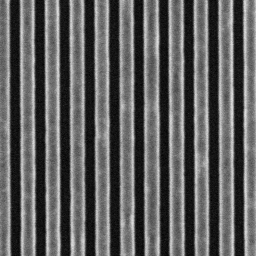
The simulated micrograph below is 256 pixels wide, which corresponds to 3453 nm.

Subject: parallel lines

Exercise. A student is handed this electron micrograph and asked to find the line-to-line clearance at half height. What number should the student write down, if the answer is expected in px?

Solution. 12.3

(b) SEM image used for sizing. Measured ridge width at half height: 179 nanometres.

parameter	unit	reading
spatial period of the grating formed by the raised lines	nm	335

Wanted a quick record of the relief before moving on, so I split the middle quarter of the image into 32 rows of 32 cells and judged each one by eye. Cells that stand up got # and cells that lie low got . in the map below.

..###...###...###...####...###..
..###...###...###...####...###..
..###...###...###...####...###..
..###...###...###...####...###..
..###...###...###...####...###..
..###...###...###...####..####..
..###...###...###...###...####..
..###...###...###...###....###..
..###...###...###...###....###..
..###...###...###...###....###..
..###...###...###...###....###..
..###...###...###...###....###..
..###...###...###...####...###..
..###...###...###...####...###..
..###...###...###...####...###..
..###...###...###...####...###..
..###...###...###...####..####..
..###...###...###...####...###..
..###...###...###...####...###..
..###...###...###...####...###..
..###...###...###...####...###..
..###...###...###...####...###..
..###...###...###...###....###..
..###...###...###...###....###..
..###...###...###...####...###..
..###...###...###...####..####..
..###...###...###...####...###..
..###...###...###...####...###..
..###...###...###...####...###..
..###...###...###...####...###..
..###...###...###...####...###..
..###...###...###...####...###..